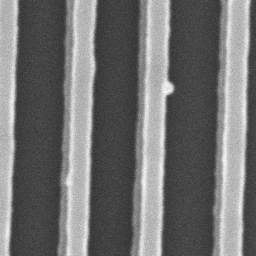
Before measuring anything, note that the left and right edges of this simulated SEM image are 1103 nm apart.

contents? lines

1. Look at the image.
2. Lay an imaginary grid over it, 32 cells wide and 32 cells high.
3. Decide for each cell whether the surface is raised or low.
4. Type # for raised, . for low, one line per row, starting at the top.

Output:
##.......###.......##........##.
##.......###.......##........##.
##.......###.......##.......###.
##.......###......###.......###.
##.......###......###.......###.
##.......###......###.......###.
##.......###......###.......###.
##.......###......###.......###.
##.......###......###.......###.
##.......###......###.......###.
##.......###......###.......###.
##.......###......###.......###.
##.......###......###.......###.
##.......##.......###.......###.
##.......##.......###.......###.
##.......##.......###.......###.
##.......##.......###.......###.
##.......##.......###.......###.
##.......##.......###.......###.
##.......##.......##........###.
##.......##.......##........###.
##.......##.......##........###.
#.......###.......##........##..
#.......###.......##........##..
#........##.......##........##..
#........##.......##........##..
#........##.......##........##..
#.......###.......##........##..
#.......###.......##........##..
#........##.......##........##..
#........##.......##........##..
#.......###.......##........##..